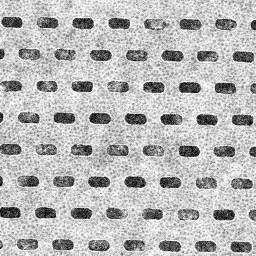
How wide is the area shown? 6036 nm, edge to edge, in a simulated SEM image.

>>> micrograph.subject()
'a regular array of holes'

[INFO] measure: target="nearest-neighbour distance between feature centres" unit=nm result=835